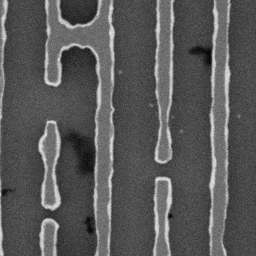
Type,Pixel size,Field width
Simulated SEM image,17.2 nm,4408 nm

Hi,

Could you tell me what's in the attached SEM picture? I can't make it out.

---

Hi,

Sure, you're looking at parallel lines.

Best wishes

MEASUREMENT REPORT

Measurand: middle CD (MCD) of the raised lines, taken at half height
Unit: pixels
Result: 14.8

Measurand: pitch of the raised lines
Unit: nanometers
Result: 972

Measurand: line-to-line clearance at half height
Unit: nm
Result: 730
